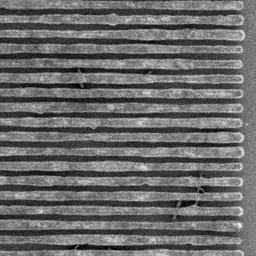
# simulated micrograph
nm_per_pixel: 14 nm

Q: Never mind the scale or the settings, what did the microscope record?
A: parallel lines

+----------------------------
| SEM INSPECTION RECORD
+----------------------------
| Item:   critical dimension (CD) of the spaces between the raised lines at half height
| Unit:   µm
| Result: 0.0979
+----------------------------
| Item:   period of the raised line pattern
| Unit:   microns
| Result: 0.206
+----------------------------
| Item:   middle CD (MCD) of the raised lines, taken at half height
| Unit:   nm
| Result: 110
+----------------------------